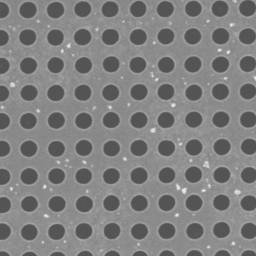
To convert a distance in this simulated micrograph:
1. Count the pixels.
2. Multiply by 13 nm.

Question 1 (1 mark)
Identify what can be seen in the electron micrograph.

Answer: a regular array of holes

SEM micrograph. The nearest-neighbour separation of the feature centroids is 353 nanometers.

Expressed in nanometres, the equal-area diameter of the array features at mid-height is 213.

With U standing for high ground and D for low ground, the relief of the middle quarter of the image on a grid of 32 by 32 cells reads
UUUDDDDUUUDDDDUUDDDDUUUUDDDDUUDD
UUUDDDDUUUDDDUUUUDDDUUUUDDDUUUUD
UUUUUUUUUUUUUUUUUUUUUUUUUUUUUUUU
UUUUUUUUUUUUUUUUUUUUUUUUUUUUUUUU
UUUUUUUUUUUUUUUUUUUUUUUUUUUUUUUU
UUUUDDUUUUUDDUUUUDDDUUUUDDDUUUUD
UUUDDDDUUUDDDDUUUDDDDUUUDDDDUUUD
UUUDDDDUUUDDDDUUUDDDDUUDDDDUUUDD
UUUDDDUUUUDDDUUUUDDDUUUUDDDUUUUD
UUUUUUUUUUUUUUUUUUUUUUUUUUUUUUUU
UUUUUUUUUUUUUUUUUUUUUUUUUUUUUUUU
UUUUUUUUUUUUUUUUUUUUUUUUUUUUUUUU
UUUUDDUUUUUDDUUUUUDDUUUUDDDUUUUD
UUUDDDDUUUDDDDUUUDDDDUUDDDDUUUDD
UUUDDDDUUUDDDDUUUDDDDUUDDDDUUUDD
UUUDDDUUUUDDDUUUUDDDUUUUDDDUUUUD
UUUUUUUUUUUUUUUUUUUUUUUUUUUUUUUU
UUUUUUUUUUUUUUUUUUUUUUUUUUUUUUUU
UUUUUUUUUUUUUUUUUUUUUUUUUUUUUUUU
UUUUDDUUUUUDDUUUUDDDUUUUDDDUUUUD
UUUDDDDUUUDDDDUUUDDDDUUUDDDDUUDD
UUUDDDDUUUDDDDUUUDDDDUUDDDDDUUDD
UUUUDDUUUUDDDUUUUDDDUUUUDDDUUUUD
UUUUUUUUUUUUUUUUUUUUUUUUUUUUUUUU
UUUUUUUUUUUUUUUUUUUUUUUUUUUUUUUU
UUUUUUUUUUUUUUUUUUUUUUUUUUUUUUUU
UUUUDDUUUUUDDUUUUDDDUUUUDDDUUUUD
UUUDDDDUUUDDDDUUUDDDDUUUDDDDUUDD
UUUDDDDUUUDDDDUUUDDDDUUUDDDDUUUD
UUUDDDUUUUDDDUUUUDDDUUUUDDDUUUUU
UUUUUUUUUUUUUUUUUUUUUUUUUUUUUUUU
UUUUUUUUUUUUUUUUUUUUUUUUUUUUUUUU